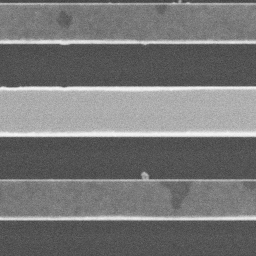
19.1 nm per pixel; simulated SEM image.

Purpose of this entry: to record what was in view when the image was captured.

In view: lines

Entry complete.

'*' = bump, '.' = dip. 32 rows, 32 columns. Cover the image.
********************************
********************************
********************************
********************************
********************************
................................
................................
................................
................................
................................
................................
********************************
********************************
********************************
********************************
********************************
********************************
................................
................................
................................
................................
................................
................................
********************************
********************************
********************************
********************************
................................
................................
................................
................................
................................